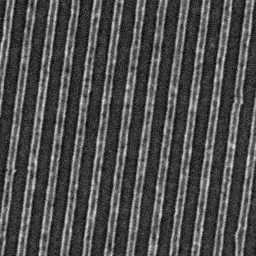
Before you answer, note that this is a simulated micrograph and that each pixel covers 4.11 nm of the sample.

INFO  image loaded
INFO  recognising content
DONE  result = parallel lines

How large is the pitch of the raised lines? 0.0888 um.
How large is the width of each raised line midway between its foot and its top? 0.028 µm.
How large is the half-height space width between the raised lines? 59.7 nanometers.